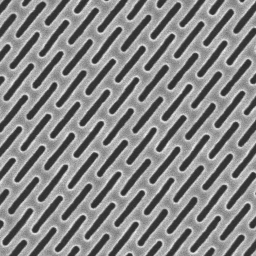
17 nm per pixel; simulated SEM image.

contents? a regular array of holes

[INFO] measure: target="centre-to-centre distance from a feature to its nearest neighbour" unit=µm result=0.511